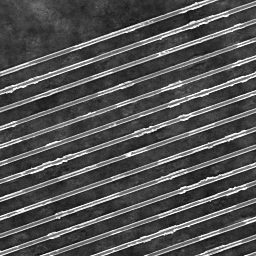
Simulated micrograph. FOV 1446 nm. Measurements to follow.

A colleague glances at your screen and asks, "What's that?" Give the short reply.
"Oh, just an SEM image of parallel lines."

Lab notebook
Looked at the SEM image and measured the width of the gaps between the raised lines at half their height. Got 70.1 nm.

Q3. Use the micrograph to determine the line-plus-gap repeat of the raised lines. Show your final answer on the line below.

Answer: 95.8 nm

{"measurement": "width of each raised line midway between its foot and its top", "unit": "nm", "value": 24.7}